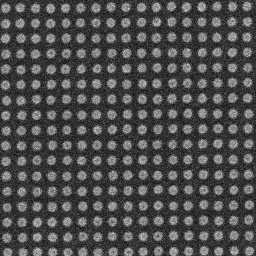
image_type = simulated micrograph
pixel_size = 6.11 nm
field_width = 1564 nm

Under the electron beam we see a regular array of raised bodies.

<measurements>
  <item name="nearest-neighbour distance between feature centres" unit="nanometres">90.2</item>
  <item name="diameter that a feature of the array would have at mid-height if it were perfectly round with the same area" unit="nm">50.6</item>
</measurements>